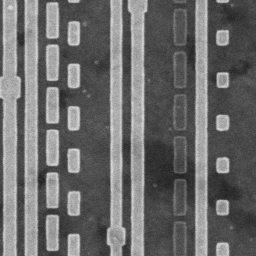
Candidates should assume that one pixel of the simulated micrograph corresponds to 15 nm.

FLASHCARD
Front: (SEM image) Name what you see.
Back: wiring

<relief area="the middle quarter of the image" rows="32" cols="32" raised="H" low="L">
LHHHLLLLLLLLHHLLLHHHLLLLLLLLHHLL
LHHHLLLLLLLLHHLLLHHHLLLLLLLLHHLL
LHHHLLLLLLLLHHLLLHHHLLLLLLLLHHLL
LHHHLLLLLLLLHHLLLHHHLLLLLLLLHHLL
LHHHLLLLLLLLHHLLLHHHLLLLLLLLHHLL
LHHHLLLLLLLLHHLLLHHHLLLLLLLLHHLL
LLLLLLLLLLLLHHLLLHHHLLLLLLLLLLLL
LLLLLLLLLLLLHHLLLHHHLLLLLLLLLLLL
LLLLLLLLLLLLHHLLLHHHLLLLLLLLHHLL
LLLLLLLLLLLLHHLLLHHHLLLLLLLLHHLL
LLLLLLLLLLLLHHLLLHHHLLLLLLLLHHLL
LHHHLLLLLLLLHHLLLHHHLLLLLLLLHHLL
LHHHLLLLLLLLHHLLLHHHLLLLLLLLHHLL
LHHHLLLLLLLLHHLLLHHHLLLLLLLLHHLL
LHHHLLLLLLLLHHLLLHHHLLLLLLLLHHLL
LHHHLLLLLLLLHHLLLHHHLLLLLLLLHHLL
LLLLLLLLLLLLHHLLLHHHLLLLLLLLLLLL
LLLLLLLLLLLLHHLLLHHHLLLLLLLLLLLL
LLLLLLLLLLLLHHLLLHHHLLLLLLLLHHLL
LLLLLLLLLLLLHHLLLHHHLLLLLLLLHHLL
LLLLLLLLLLLLHHLLLHHHLLLLLLLLHHLL
LHHLLLLLLLLLHHLLLHHHLLLLLLLLHHLL
LHHHLLLLLLLLHHLLLHHHLLLLLLLLHHLL
LHHHLLLLLLLLHHLLLHHHLLLLLLLLHHLL
LHHHLLLLLLLLHHLLLHHHLLLLLLLLHHLL
LHHHLLLLLLLLHHLLLHHHLLLLLLLLHHLL
LHHHLLLLLLLLHHLLLHHHLLLLLLLLHHLL
LLLLLLLLLLLLHHLLLHHHLLLLLLLLLLLL
LLLLLLLLLLLLHHLLLHHHLLLLLLLLLLLL
LLLLLLLLLLLLHHLLLHHHLLLLLLLLHHLL
LLLLLLLLLLLLHHLLLHHHLLLLLLLLHHLL
LLLLLLLLLLLLHHLLLHHHLLLLLLLLHHLL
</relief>